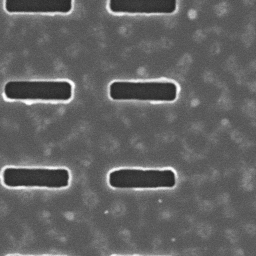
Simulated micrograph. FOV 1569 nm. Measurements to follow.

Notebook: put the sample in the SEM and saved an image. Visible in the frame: holes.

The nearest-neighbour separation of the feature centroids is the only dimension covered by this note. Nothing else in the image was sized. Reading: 537 nanometers